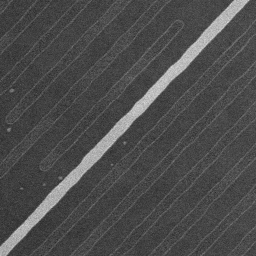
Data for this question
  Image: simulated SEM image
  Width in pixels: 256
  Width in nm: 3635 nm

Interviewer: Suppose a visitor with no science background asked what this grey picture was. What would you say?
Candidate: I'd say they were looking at groups of lines, slits or small figures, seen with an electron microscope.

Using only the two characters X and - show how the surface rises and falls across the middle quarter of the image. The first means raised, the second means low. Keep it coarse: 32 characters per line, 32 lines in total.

X------XXXX------XXXX------XXXX-
------XXXX------XXXX------XXXX--
-----XXXX------XXXX------XXXX---
----XXXX------XXXX------XXX-----
---XXXX------XXXX------XXXX-----
--XXXX------XXXX------XXXX------
-XXXX------XXXX------XXXX------X
-XXX-------XXX-------XXX------XX
XXX-------XXX-------XXX------XXX
XX------XXXX------XXXX------XXXX
XX-----XXXX-------XXX------XXXX-
X------XXX-------XXX-------XXX--
------XXX-------XXX-------XXX---
-----XXX-------XXX------XXXX----
----XXX-------XXX------XXXX-----
---XXXX------XXX-------XXX------
--XXX-------XXX-------XXX------X
-XXXX------XXXX------XXX-------X
XXXX------XXX-------XXXX------XX
XXX------XXXX------XXX-------XXX
XX------XXXX------XXX-------XXX-
X------XXXX------XXX-------XXX--
------XXXX------XXX-------XXX---
-----XXXX------XXX-------XXX----
----XXXX------XXXX------XXX-----
----XXX------XXXX------XXX------
--XXXX------XXXX------XXX-------
-XXXX------XXXX------XXXX------X
XXXX------XXXX------XXXX------XX
XXX------XXXX------XXXX------XXX
XX------XXXX------XXXX------XXXX
X------XXXX------XXXX------XXXX-